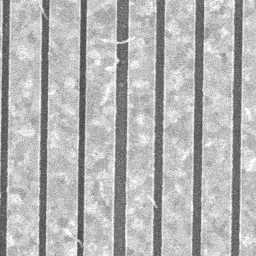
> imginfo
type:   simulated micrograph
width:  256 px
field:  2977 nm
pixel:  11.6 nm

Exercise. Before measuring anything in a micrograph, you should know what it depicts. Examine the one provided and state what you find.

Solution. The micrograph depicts parallel lines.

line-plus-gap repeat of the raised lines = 38.6 px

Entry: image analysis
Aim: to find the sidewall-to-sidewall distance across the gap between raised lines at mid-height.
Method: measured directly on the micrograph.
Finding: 103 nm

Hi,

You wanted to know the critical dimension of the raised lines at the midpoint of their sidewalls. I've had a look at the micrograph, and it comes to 340 nanometres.